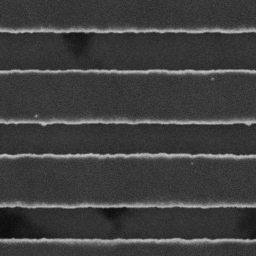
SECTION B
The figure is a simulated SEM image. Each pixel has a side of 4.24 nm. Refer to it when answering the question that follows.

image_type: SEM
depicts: lines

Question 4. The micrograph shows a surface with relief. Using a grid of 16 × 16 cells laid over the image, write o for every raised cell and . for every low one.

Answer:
oooooooooooooooo
oooooooooooooooo
................
................
oooooooooooooooo
oooooooooooooooo
oooooooooooooooo
oooooooooooooooo
................
................
oooooooooooooooo
oooooooooooooooo
oooooooooooooooo
................
................
oooooooooooooooo